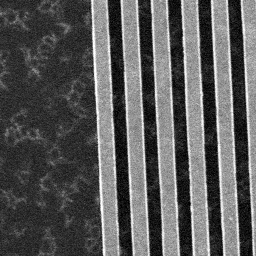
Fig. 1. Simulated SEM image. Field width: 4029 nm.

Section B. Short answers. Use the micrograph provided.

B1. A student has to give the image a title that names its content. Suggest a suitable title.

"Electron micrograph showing parallel lines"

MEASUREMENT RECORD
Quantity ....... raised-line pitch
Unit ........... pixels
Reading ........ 30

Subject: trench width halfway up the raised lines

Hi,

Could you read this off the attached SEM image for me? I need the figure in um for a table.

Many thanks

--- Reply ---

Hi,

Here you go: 0.23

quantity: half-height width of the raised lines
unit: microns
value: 0.242